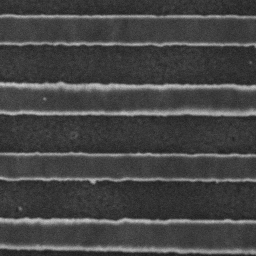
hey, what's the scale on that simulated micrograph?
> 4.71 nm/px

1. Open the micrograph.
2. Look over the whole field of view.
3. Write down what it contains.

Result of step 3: lines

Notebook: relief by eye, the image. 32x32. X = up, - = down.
--------------------------------
--------------------------------
XXXXXXXXXXXXXXXXXXXXXXXXXXXXXXXX
XXXXXXXXXXXXXXXXXXXXXXXXXXXXXXXX
XXXXXXXXXXXXXXXXXXXXXXXXXXXXXXXX
XXXXXXXXXXXXXXXXXXXXXXXXXXXXXXXX
--------------------------------
--------------------------------
--------------------------------
--------------------------------
XXXX---X------------------------
XXXXXXXXXXXXXXXXXXXXXXXXXXXXXXXX
XXXXXXXXXXXXXXXXXXXXXXXXXXXXXXXX
XXXXXXXXXXXXXXXXXXXXXXXXXXXXXXXX
--------------------------------
--------------------------------
--------------------------------
--------------------------------
--------------------------------
XXXXXXXXXXXXXXXXXXXXXXXXXXXXXXXX
XXXXXXXXXXXXXXXXXXXXXXXXXXXXXXXX
XXXXXXXXXXXXXXXXXXXXXXXXXXXXXXXX
-XX--XXXX-XXXXXXXXX-XXXXXXXXXXXX
--------------------------------
--------------------------------
--------------------------------
--------------------------------
XXXXXXXXXXXX---XXX---XXX----X---
XXXXXXXXXXXXXXXXXXXXXXXXXXXXXXXX
XXXXXXXXXXXXXXXXXXXXXXXXXXXXXXXX
XXXXXXXXXXXXXXXXXXXXXXXXXXXXXXXX
----------------------XXXXXXXXXX